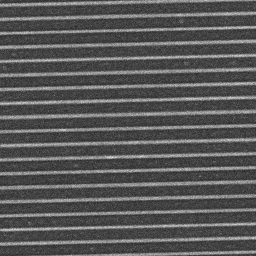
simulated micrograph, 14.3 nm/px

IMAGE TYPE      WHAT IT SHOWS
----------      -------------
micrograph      parallel lines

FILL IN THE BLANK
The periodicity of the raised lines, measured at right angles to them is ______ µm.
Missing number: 0.201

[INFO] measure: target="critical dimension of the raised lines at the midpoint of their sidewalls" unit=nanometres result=41.2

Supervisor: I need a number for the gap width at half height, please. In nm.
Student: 168